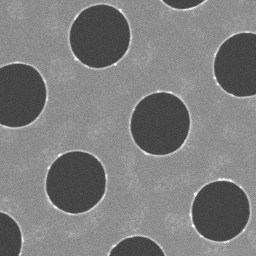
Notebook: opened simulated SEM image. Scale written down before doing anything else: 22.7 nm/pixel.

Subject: holes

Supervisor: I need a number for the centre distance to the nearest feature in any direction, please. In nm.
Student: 2370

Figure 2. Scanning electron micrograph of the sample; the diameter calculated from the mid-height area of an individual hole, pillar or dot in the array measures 1400 nanometres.